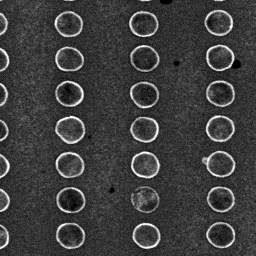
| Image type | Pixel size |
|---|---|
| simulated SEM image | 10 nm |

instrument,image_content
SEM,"a regular array of raised bodies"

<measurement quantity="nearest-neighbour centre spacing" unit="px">35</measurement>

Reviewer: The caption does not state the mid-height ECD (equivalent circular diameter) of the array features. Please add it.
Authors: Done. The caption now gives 0.263 um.